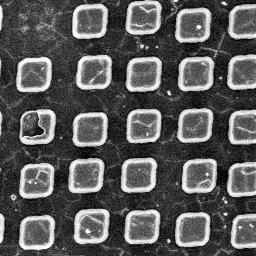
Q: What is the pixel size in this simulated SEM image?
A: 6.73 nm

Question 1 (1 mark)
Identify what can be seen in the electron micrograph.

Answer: a regular array of raised bodies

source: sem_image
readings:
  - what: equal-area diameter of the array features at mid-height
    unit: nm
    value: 228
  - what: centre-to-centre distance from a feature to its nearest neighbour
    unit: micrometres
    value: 0.333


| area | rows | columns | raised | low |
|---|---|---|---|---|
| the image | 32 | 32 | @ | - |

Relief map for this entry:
-----------------@@@------------
---------@@@@---@@@@---@@@---@@@
---------@@@@---@@@@--@@@@---@@@
---------@@@@---@@@@--@@@@---@@@
----------@@----------@@@@---@@@
--------------------------------
--------------------------------
----@@----@@@@---@@@---@@@---@@@
--@@@@----@@@@--@@@@---@@@---@@@
--@@@@----@@@@--@@@@---@@@---@@@
--@@@@----@@@---@@@@---@@@---@@@
--------------------------------
--------------------------------
--------------------------------
-----@@---@@@---@@@@---@@@---@@@
-----@@--@@@@---@@@@---@@@---@@@
-----@@--@@@@---@@@@--@@@@---@@@
---@@@---@@@@---@@@----@@----@@@
--------------------------------
--------------------------------
---------@@@@---@@@----@@@@-----
---@@@@--@@@@--@@@@----@@@@--@@@
---@@@@--@@@@--@@@@----@@@@--@@@
---@@@---@@@----@@@----@@@---@@@
---@----------------------------
--------------------------------
----------@@@-----@-------------
---@@@----@@@---@@@@--@@@@---@@@
---@@@@---@@@---@@@@--@@@@---@@@
---@@@----@@@---@@@@--@@@@---@@@
---@@@-----------------@@----@@@
--------------------------------